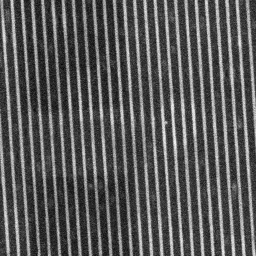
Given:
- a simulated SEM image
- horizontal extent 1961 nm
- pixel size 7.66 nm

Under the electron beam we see parallel lines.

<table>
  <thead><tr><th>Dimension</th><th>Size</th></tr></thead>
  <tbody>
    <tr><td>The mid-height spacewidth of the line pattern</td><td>61.2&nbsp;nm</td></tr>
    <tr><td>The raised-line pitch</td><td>0.0783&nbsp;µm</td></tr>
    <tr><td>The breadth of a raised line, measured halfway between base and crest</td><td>2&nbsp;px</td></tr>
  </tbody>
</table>